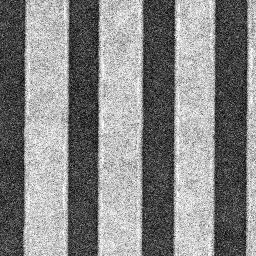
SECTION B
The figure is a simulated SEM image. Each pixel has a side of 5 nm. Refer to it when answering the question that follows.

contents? one or a few lines or trenches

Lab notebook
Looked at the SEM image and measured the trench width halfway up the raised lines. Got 169 nanometers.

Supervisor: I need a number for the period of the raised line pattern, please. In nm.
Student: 370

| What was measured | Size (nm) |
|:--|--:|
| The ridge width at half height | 205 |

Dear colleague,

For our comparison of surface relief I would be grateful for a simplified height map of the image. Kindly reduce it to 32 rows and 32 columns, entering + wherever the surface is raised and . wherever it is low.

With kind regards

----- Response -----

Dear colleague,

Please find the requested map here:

...+++++.....+++++....+++++....+
...+++++.....+++++....+++++....+
...+++++.....+++++....+++++....+
...+++++....++++++....+++++....+
...+++++....++++++....+++++....+
...+++++....++++++....+++++....+
...+++++....++++++....+++++....+
...+++++....++++++....+++++....+
...+++++.....+++++....+++++....+
...+++++....++++++....+++++....+
...+++++....++++++....+++++....+
...+++++....++++++....+++++....+
...+++++....++++++....+++++....+
...+++++....++++++....+++++....+
...+++++.....+++++....+++++....+
...+++++.....+++++....+++++....+
...+++++....++++++....+++++....+
...+++++....++++++....+++++....+
...+++++....++++++....+++++....+
...+++++....++++++....+++++....+
...+++++....++++++....+++++....+
...+++++....++++++....+++++....+
...+++++.....+++++....+++++....+
...+++++.....+++++....+++++....+
...+++++.....+++++....+++++....+
...+++++....++++++....+++++....+
...+++++....++++++....+++++....+
...+++++....++++++....+++++....+
...+++++....++++++....+++++....+
...+++++....++++++....+++++....+
...+++++....++++++....+++++....+
...+++++....++++++....+++++....+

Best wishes